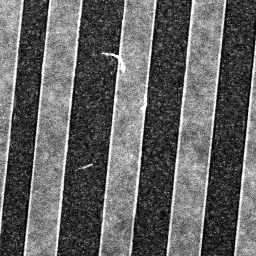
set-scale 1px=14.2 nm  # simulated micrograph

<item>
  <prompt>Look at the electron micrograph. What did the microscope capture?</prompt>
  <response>one or a few lines or trenches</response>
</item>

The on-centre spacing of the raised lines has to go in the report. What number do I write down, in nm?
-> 1010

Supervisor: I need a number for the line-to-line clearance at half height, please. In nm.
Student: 525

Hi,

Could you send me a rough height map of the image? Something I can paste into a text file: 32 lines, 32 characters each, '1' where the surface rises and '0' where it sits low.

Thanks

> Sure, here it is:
11100011110000001110000011110000
11100011110000001110000011110000
11100011110000011110000011110000
11100011110000011110000011110000
11000011110000011110000011110000
11000011110000011110000011110000
11000011110000011110000111100000
11000011100000011110000111100000
11000111100000011110000111100000
11000111100000011100000111100000
11000111100000011100000111100000
11000111100000111100000111100001
11000111100000111100000111100001
10000111100000111100000111100001
10000111100000111100000111100001
10000111100000111100000111100001
10000111000000111100001111000001
10000111000000111100001111000001
10001111000000111100001111000001
10001111000000111000001111000001
10001111000000111000001111000001
10001111000001111000001111000011
10001111000001111000001111000011
00001111000001111000001111000011
00001111000001111000001111000011
00001111000001111000001111000011
00001111000001111000011110000011
00001110000001111000011110000011
00011110000001111000011110000011
00011110000001110000011110000011
00011110000001110000011110000011
00011110000011110000011110000111